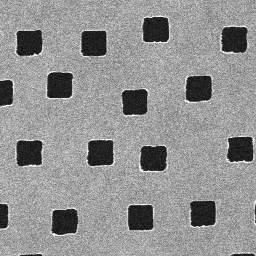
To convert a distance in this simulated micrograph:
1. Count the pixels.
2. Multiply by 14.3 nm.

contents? a regular array of holes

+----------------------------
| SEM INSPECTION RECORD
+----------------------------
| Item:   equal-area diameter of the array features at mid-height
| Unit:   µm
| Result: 0.402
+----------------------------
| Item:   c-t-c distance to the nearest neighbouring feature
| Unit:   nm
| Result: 868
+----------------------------